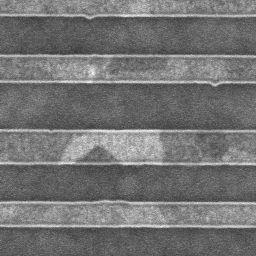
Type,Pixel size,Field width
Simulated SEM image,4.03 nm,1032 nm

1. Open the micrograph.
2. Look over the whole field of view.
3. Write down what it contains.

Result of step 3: one or a few lines or trenches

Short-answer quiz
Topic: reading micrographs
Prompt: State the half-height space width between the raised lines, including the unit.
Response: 162 nm